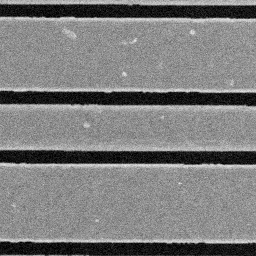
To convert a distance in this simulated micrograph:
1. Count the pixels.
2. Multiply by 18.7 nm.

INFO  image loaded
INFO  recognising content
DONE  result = lines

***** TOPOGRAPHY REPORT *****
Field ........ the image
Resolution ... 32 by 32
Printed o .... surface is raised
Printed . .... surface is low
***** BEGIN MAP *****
................................
................................
oooooooooooooooooooooooo..ooo..o
oooooooooooooooooooooooooooooooo
oooooooooooooooooooooooooooooooo
oooooooooooooooooooooooooooooooo
oooooooooooooooooooooooooooooooo
oooooooooooooooooooooooooooooooo
oooooooooooooooooooooooooooooooo
oooooooooooooooooooooooooooooooo
oooooooooooooooooooooooooooooooo
................................
................................
ooooooooooooooooooooooooooooooo.
oooooooooooooooooooooooooooooooo
oooooooooooooooooooooooooooooooo
oooooooooooooooooooooooooooooooo
oooooooooooooooooooooooooooooooo
..................o.o.oooooooooo
................................
................................
oooooooooooooooooooooooooooooooo
oooooooooooooooooooooooooooooooo
oooooooooooooooooooooooooooooooo
oooooooooooooooooooooooooooooooo
oooooooooooooooooooooooooooooooo
oooooooooooooooooooooooooooooooo
oooooooooooooooooooooooooooooooo
oooooooooooooooooooooooooooooooo
oooooooooooooooooooooooooooooooo
................................
................................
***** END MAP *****